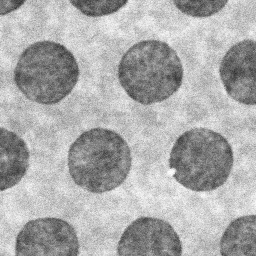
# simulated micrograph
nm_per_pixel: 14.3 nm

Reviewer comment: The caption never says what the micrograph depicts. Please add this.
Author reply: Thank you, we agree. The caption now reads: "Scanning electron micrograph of holes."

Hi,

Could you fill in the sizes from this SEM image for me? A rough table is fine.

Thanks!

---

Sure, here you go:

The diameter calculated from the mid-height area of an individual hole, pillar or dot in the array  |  922 nm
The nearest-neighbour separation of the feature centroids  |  1460 nm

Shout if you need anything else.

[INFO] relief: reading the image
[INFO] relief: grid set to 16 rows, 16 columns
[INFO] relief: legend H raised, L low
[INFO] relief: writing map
LHHHHLLLHHHLLLHH
HHHHHHHHHHHHHHHH
HHHHHHHHHLHHHHHH
HLLLLHHHLLLHHHLL
HLLLLHHLLLLHHHLL
HLLLLHHHLLLHHHLL
HHHHHHHHHHHHHHHL
HHHHHHHHHHHHHHHH
LHHHHLLLHHHLLLHH
LLHHLLLLHHHLLLLH
LLHHLLLLHHHLLLHH
LHHHHLLLHHHLLLHH
HHHHHHHHHHHHHHHH
HHHHHHHHHHHHHHHL
HLLLLHHHLLLHHHLL
HLLLLHHLLLLHHHLL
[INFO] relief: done